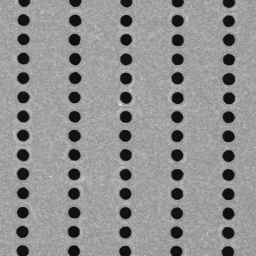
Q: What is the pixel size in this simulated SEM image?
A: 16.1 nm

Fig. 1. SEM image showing a regular array of holes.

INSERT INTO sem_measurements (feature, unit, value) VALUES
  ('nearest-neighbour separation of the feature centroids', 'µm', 0.307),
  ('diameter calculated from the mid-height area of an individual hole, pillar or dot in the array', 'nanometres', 192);